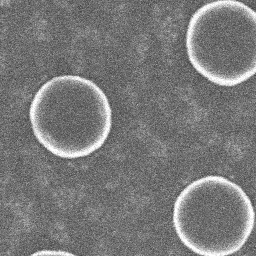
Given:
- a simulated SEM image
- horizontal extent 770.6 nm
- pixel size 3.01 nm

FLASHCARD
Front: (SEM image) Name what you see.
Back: raised bodies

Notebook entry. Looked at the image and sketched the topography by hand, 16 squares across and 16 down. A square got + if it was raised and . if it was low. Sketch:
.............++.
............++++
............++++
............++++
.............+++
...+++..........
..+++++.........
..+++++.........
..+++++.........
....+...........
................
............+++.
...........++++.
...........+++++
...........+++++
............+++.